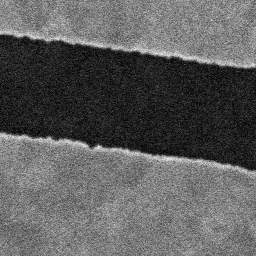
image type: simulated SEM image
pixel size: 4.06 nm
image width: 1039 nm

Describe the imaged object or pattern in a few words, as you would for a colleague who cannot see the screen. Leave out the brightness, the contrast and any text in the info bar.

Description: one or a few lines or trenches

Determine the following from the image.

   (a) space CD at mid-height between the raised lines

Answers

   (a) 99.3 pixels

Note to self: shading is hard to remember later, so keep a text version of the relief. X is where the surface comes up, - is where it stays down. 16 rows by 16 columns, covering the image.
XXXXXXXXXXXXXXXX
XXXXXXXXXXXXXXXX
----XXXXXXXXXXXX
-----------XXXXX
----------------
----------------
----------------
----------------
X---------------
XXXXXXXX--------
XXXXXXXXXXXXXXX-
XXXXXXXXXXXXXXXX
XXXXXXXXXXXXXXXX
XXXXXXXXXXXXXXXX
XXXXXXXXXXXXXXXX
XXXXXXXXXXXXXXXX